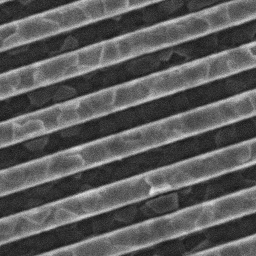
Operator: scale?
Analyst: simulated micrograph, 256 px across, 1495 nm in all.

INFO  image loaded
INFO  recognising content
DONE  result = parallel lines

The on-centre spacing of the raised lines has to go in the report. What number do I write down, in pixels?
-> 46.1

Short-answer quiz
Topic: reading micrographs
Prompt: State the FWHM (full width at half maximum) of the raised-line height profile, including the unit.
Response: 139 nm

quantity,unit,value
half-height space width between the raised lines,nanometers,129